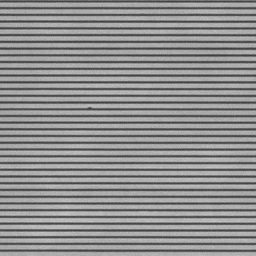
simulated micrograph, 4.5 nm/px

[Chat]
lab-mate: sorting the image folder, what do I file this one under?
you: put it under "parallel lines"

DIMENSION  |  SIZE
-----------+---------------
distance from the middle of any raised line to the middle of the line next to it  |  30.2 nm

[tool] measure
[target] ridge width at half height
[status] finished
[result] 0.018 µm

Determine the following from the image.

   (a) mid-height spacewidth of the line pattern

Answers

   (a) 9 nanometres